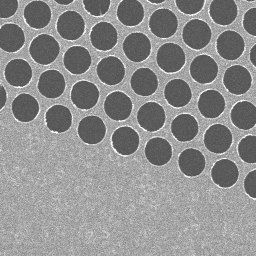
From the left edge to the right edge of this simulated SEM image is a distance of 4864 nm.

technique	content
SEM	a regular array of holes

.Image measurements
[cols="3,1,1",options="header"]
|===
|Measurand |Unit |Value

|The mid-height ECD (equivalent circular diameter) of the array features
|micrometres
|0.539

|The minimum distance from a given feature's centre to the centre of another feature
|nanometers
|664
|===